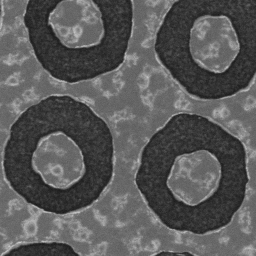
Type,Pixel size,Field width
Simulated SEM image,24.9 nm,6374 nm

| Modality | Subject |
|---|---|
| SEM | ring-shaped grooves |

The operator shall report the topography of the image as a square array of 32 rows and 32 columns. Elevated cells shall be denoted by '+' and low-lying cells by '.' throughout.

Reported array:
+++....+++++.....+++++..........
+++....+++++.....++++...........
+++...+++++++....+++.....++++...
+++....++++++....+++....+++++...
++++...++++++...++++....++++++..
++++....++++....+++.....++++++..
++++............+++.....++++++..
+++++..........+++++....+++++...
+++++..........++++++.....++....
++++++......+++++++++...........
++++++++++++++++++++++.........+
+++++++++++++++++++++++.......++
+++++.....++++++++++++++++++++++
++++.......+++++++++++++++++++++
++..........++++++++++...+++++++
++...........++++++++......+++++
+.............++++++........++++
+....++++.....+++++...........++
+....+++++....++++.............+
....++++++....++++.....++++....+
....++++++....+++.....+++++....+
+....+++++....+++....+++++++...+
+....+++++....+++....++++++....+
++.....+.....++++....++++++....+
+++.........++++++....++++.....+
++++........++++++.....++.....++
++++++...++++++++++...........++
++++++++++++++++++++.........+++
+++++++++++++++++++++.......++++
++++++++++++++++++++++++++++++++
+++.....++++++++++++++++++++++++
+.........++++++++++.+++++++++++